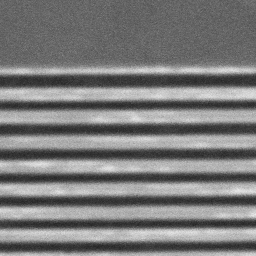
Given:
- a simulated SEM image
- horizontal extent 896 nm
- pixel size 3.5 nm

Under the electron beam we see parallel lines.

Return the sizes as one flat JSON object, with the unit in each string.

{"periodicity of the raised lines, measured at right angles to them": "0.0823 micrometres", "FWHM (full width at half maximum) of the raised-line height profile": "37.2 nm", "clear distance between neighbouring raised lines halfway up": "44.2 nm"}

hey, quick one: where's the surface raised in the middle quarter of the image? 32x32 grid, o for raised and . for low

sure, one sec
oooooooooooooooooooooooooooooooo
oooooooooooooooooooooooooooooooo
................................
................................
................................
................................
oooooooooooooooooooooooooooooooo
oooooooooooooooooooooooooooooooo
oooooooooooooooooooooooooooooooo
................................
................................
................................
oooooooooooooooooooooooooooooooo
oooooooooooooooooooooooooooooooo
................................
................................
................................
................................
ooooooooooooooooo.oooooooooooooo
oooooooooooooooooooooooooooooooo
oooooooooooooooooooooooooooooooo
................................
................................
................................
...oo..ooo......................
oooooooooooooooooooooooooooooooo
oooooooooooooooooooooooooooooooo
................................
................................
................................
oooooooooooooooooooooooooooooooo
oooooooooooooooooooooooooooooooo